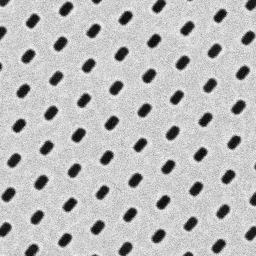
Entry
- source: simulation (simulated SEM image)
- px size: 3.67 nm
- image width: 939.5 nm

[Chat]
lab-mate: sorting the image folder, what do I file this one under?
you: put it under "a regular array of holes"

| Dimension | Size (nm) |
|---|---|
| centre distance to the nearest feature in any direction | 127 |